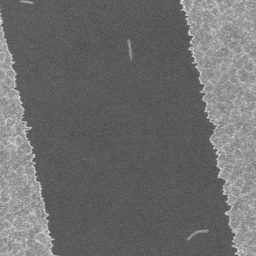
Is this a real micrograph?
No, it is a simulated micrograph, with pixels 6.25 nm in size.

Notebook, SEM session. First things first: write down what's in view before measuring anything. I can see one or a few lines or trenches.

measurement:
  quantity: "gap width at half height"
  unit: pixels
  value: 181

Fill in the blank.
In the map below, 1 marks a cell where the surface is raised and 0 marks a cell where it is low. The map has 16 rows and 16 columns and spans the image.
0000000000001111
0000000000001111
0000000000001111
1000000000001111
1000000000001111
1000000000000111
1000000000000111
1000000000000111
1100000000000111
1100000000000011
1100000000000001
1100000000000011
1110000000000011
1110000000000011
1110000000000001
1110000000000001